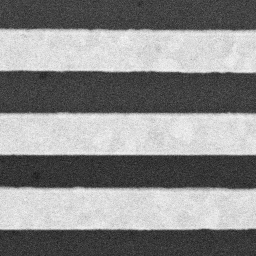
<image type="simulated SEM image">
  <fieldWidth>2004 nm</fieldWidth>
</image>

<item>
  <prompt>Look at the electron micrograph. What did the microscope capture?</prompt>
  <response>lines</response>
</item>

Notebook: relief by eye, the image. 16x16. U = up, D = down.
DDDDDDDDDDDDDDDD
DDDDDDDDDDDDDDDD
UUUUUUUUUUUUUUUU
UUUUUUUUUUUUUUUU
DDDDDDDDDDDUUUUU
DDDDDDDDDDDDDDDD
DDDDDDDDDDDDDDDD
UUUUUUUUUUUUUUUU
UUUUUUUUUUUUUUUU
UUUUUUUUUUUUUUUU
DDDDDDDDDDDDDDDD
DDDDDDDDDDDDDDDD
UUUUUUUUUUUUUUUU
UUUUUUUUUUUUUUUU
DDDDDDDDDDDDDDDD
DDDDDDDDDDDDDDDD